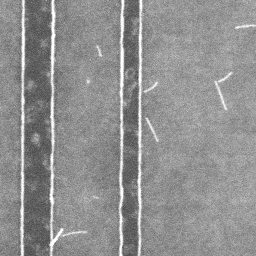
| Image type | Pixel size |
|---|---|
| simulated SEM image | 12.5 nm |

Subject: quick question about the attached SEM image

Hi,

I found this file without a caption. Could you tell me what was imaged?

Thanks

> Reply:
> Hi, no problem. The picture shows one or a few lines or trenches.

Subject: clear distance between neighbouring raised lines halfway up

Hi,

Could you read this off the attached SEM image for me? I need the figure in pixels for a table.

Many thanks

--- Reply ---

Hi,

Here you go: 68.9